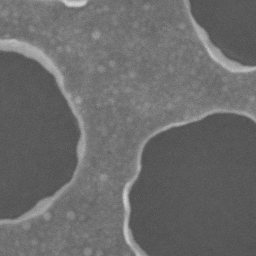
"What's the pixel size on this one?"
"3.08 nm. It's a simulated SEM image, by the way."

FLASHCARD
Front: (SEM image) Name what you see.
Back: holes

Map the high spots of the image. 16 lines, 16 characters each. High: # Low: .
############....
############....
#############...
..############..
...#############
....############
....############
.....#######....
.....#####......
.....####.......
.....####.......
....####........
...#####........
..######........
########........
########........